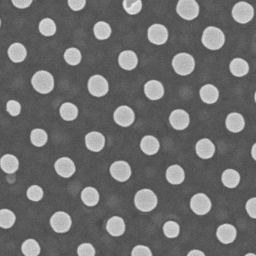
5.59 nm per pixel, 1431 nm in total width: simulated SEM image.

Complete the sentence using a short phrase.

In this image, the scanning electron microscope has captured a regular array of raised bodies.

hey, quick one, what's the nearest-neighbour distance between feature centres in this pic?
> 217 nm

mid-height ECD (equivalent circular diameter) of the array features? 109 nm